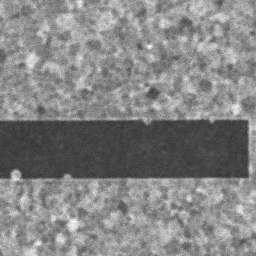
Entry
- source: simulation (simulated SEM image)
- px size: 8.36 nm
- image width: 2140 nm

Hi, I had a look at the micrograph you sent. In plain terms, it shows one or a few lines or trenches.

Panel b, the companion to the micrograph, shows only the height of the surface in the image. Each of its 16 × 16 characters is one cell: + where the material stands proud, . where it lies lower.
++++++++++++++++
++++++++++++++++
++++++++++++++++
++++++++++++++++
++++++++++++++++
++++++++++++++++
++++++++++++++++
...............+
................
................
................
++++++++++++++++
++++++++++++++++
++++++++++++++++
++++++++++++++++
++++++++++++++++